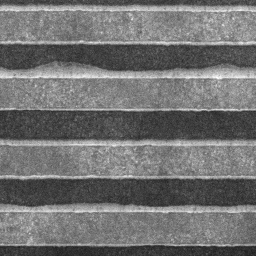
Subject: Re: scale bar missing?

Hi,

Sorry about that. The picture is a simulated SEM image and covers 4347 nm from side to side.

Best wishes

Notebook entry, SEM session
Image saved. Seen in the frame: lines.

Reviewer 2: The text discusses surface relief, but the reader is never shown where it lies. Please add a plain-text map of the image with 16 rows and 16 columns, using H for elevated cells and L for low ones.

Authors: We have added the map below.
LLLLLLLLLLLLLLLL
HHHHHHHHHHHHHHHH
HHHHHHHHHHHHHHHH
LLLLLLLLLLLLLLLL
LLLLLLLLLLLLLLLL
HHHHHHHHHHHHHHHH
HHHHHHHHHHHHHHHH
LLLLLLLLLLLLLLLL
LLLLLLLLLLLLLLLL
HHHHHHHHHHHHHHHH
HHHHHHHHHHHHHHHH
LLLLLLLLLLLLLLLL
LLLLLLLLLLLLLLLL
HHHHHHHHHHHHHHHH
HHHHHHHHHHHHHHHH
LLLLLLLLLLLLLLLL